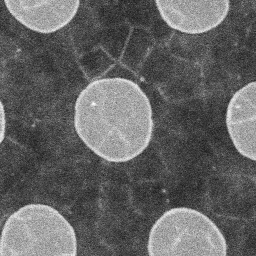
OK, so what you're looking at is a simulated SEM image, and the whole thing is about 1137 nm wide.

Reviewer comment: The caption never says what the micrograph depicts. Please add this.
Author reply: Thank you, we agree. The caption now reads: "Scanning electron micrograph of raised bodies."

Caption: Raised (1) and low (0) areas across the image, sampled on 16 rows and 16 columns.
0111100000111100
0111000000011100
0000000000000000
0000000000000000
0000000000000000
0000011110000001
0000011110000011
0000011110000011
0000011110000011
0000001110000001
0000000000000000
0000000000000000
0000000000000000
0111000000111000
1111100001111100
1111100001111100